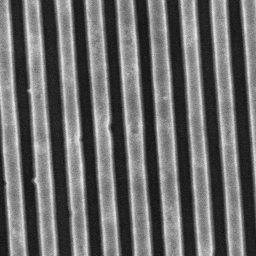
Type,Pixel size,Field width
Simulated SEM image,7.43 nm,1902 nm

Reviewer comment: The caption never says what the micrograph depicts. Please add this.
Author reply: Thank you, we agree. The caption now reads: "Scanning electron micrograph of parallel lines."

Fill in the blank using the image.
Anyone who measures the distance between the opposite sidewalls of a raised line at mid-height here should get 117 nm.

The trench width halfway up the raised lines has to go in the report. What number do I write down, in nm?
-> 110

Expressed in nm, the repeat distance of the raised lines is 231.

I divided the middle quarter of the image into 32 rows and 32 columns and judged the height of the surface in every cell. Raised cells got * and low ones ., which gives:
***....****...****....****....**
***....****...*****...****.....*
***....****...*****...****.....*
***....****...*****...*****....*
***....****....****...*****....*
***....****....****...*****....*
***....****....****....****....*
***....****....****....****....*
***....****....****....****....*
***....****....****....****....*
***....****....****....****....*
****...****....****....****....*
****....***....*****...****....*
****....***....*****...****....*
****....***....*****...****....*
****....***....*****...****....*
****....***....*****...****....*
****....****...*****...*****...*
.***....****....****...*****...*
.***....****....****...*****....
.***....****....****....****....
.***....****....****....****....
.***....****....****....****....
.***....****....****....****....
.***....****....****....****....
.****...****....****....****....
.****...****....****....****....
.****....***....****....****....
.****....***....****....****....
.****....***.....****...****....
.****....****....****...****....
.****....****....****...*****...